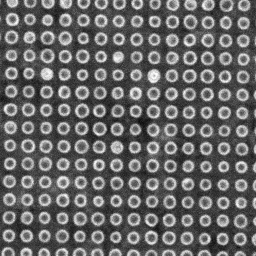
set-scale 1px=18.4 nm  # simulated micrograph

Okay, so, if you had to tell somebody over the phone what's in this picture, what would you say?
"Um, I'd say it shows a regular array of raised bodies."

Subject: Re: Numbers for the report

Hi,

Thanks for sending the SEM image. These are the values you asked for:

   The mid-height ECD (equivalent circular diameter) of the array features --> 215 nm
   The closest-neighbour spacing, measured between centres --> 325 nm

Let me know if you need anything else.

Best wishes